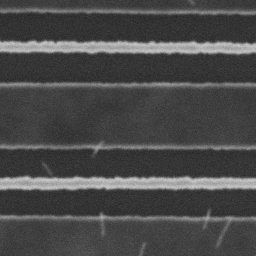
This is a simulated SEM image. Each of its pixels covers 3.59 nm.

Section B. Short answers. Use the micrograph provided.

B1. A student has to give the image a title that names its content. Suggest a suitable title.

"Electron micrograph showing lines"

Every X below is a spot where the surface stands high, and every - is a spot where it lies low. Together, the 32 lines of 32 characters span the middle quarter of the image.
--------------------------------
--------------------------------
--------------------------------
--------------------------------
--------------------------------
XXXXXXXXXXXXXXXXXXXXXXXXXXXXXXXX
XXXXXXXXXXXXXXXXXXXXXXXXXXXXXXXX
XXXXXXXXXXXXXXXXXXXXXXXXXXXXXXXX
XXXXXXXXXXXXXXXXXXXXXXXXXXXXXXXX
XXXXXXXXXXXXXXXXXXXXXXXXXXXXXXXX
XXXXXXXXXXXXXXXXXXXXXXXXXXXXXXXX
XXXXXXXXXXXXXXXXXXXXXXXXXXXXXXXX
XXXXXXXXXXXXXXXXXXXXXXXXXXXXXXXX
XXXXXXXXXXXXXXXXXXXXXXXXXXXXXXXX
XXXXXXXXXXXXXXXXXXXXXXXXXXXXXXXX
XXXXXXXXXXXXXXXXXXXXXXXXXXXXXXXX
XXXXXXXXXXXXXXXXXXXXXXXXXXXXXXXX
XXXXXXXXXXXXXXXXXXXXXXXXXXXXXXXX
XXXXXXXXXXXXXXXXXXXXXXXXXXXXXXXX
XXXXXXXXXXXXXXXXXXXXXXXXXXXXXXXX
XXXXXXXXXXXXXXXXXXXXXXXXXXXXXXXX
--------------------------------
--------------------------------
--------------------------------
--------------------------------
--------------------------------
--------------------------------
--------------------------------
--XX---X-----X---X----X-------XX
XXXXXXXXXXXXXXXXXXXXXXXXXXXXXXXX
XXXXXXXXXXXXXXXXXXXXXXXXXXXXXXXX
--------------------------------